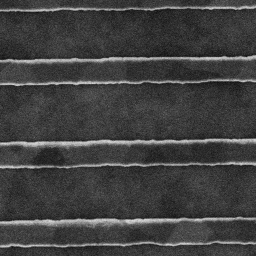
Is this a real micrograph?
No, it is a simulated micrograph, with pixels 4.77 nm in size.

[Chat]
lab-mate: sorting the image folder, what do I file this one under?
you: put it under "lines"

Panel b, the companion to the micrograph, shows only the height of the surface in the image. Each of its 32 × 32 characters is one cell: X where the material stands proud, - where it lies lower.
XXXXXXXXXXXXXXXXXXXXXXXXXXXXXXXX
--------------------------------
--------------------------------
--------------------------------
--------------------------------
--------------------------------
--------------------------------
-X---XXXXXXXXXXXXXXXXXXXXXXXXXXX
XXXXXXXXXXXXXXXXXXXXXXXXXXXXXXXX
XXXXXXXXXXXXXXXXXXXXXXXXXXXXXXXX
XXXXXX-X-X----------------------
--------------------------------
--------------------------------
--------------------------------
--------------------------------
--------------------------------
--------------------------------
-------------------------XXXXXXX
XXXXXXXXXXXXXXXXXXXXXXXXXXXXXXXX
XXXXXXXXXXXXXXXXXXXXXXXXXXXXXXXX
XXXXXXXXXXXXXXXXXXXXXXXXXXXXXXXX
--------------------------------
--------------------------------
--------------------------------
--------------------------------
--------------------------------
--------------------------------
------------XXX----XXXXXXXXXXXXX
XXXXXXXXXXXXXXXXXXXXXXXXXXXXXXXX
XXXXXXXXXXXXXXXXXXXXXXXXXXXXXXXX
XXXXXXXXXXXXXXXXX--XXXX---------
--------------------------------